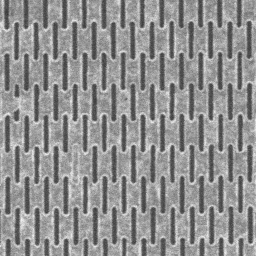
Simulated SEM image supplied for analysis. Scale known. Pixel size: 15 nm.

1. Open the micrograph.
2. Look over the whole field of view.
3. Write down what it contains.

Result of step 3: a regular array of holes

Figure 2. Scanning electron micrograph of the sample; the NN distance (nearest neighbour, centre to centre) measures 289 nanometres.